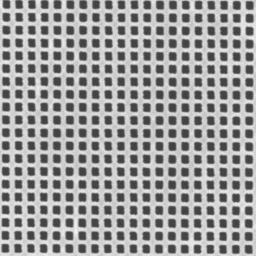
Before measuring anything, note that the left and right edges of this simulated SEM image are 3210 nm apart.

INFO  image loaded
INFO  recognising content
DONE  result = a regular array of holes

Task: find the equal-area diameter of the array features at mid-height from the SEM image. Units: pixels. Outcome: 9.43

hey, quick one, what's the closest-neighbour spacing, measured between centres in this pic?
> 159 nanometers